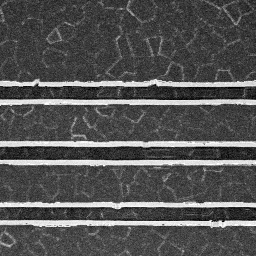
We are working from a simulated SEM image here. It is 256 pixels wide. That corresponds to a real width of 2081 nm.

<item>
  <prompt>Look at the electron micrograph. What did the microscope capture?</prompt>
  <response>parallel lines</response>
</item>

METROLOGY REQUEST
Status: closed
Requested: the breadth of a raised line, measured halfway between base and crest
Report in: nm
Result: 346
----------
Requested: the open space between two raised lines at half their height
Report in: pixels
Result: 17.9